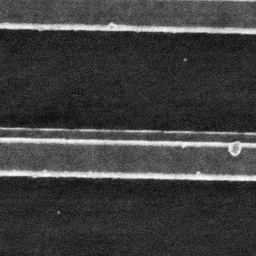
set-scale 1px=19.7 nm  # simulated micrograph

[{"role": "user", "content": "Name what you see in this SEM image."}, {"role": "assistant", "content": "lines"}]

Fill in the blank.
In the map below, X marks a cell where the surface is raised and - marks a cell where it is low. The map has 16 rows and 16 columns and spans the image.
XXXXXXXXXXXXXXXX
XXXXXXXXXXXXXXXX
----------------
----------------
----------------
----------------
----------------
----------------
XXXXXXXXXXXXXXXX
XXXXXXXXXXXXXXXX
XXXXXXXXXXXXXXXX
----------------
----------------
----------------
----------------
----------------